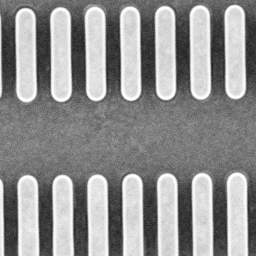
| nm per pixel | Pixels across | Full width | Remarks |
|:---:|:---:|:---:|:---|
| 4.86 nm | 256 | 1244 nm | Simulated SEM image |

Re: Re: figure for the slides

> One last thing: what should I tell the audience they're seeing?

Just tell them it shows groups of lines, slits or small figures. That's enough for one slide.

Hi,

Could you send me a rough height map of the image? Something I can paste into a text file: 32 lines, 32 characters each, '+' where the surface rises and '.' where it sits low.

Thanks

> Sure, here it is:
................................
..++...+...++..++...++..++..++..
..++..+++..++..++..+++..++..+++.
..++..+++..++..++..+++..++..+++.
..++..+++..++..++..+++..++..+++.
..++..+++..++..++..+++..++..+++.
..++..+++..++..++..+++..++..+++.
..++..+++..++..++...++..++..+++.
..++..+++..++..+++..++..++..+++.
..++..+++..++..+++..++..++..+++.
..+++.+++..++..+++..++..++..+++.
..+++.+++..++..+++..++..++..+++.
...+...+........................
................................
................................
................................
................................
................................
................................
................................
................................
................................
...+...++..++...++..++..++...++.
..+++..++..++..+++..++..++..+++.
..+++..++..++..+++..++..++..+++.
..+++..++..++..+++..++..++..+++.
..+++..++..++..+++..++..++..+++.
..+++..++..++..+++..++..+++.+++.
..+++..++..++..+++..++..+++.+++.
..+++..++..++..+++..++..+++..++.
..+++..++..++..+++..++..+++..++.
..+++..++..++..+++..++..+++..++.